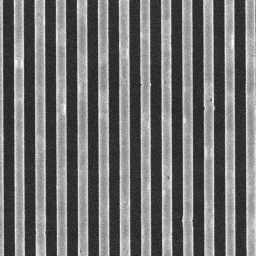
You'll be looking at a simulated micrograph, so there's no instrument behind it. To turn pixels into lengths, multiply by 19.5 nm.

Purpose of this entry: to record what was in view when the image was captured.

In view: parallel lines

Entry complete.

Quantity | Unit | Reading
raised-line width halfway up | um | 0.187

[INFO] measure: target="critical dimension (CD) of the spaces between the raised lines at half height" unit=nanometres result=226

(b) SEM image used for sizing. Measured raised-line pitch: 410 nanometres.